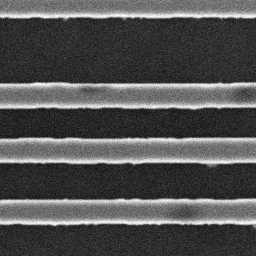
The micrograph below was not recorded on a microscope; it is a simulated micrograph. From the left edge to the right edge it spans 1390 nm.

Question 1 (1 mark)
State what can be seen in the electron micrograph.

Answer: lines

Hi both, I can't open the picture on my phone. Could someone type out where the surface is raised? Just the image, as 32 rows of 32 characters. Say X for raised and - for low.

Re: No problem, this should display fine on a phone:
XXXXXXXXXXXXXXXXXXXXXXXXXXXXXXXX
XXXXXXXXXXXXXXXXXXXXXXXXXXXXXXXX
--------------------------------
--------------------------------
--------------------------------
--------------------------------
--------------------------------
--------------------------------
--------------------------------
--------------------------------
----XXXXX------------------X-XXX
XXXXXXXXXXXXXXXXXXXXXXXXXXXXXXXX
XXXXXXXXXXXXXXXXXXXXXXXXXXXXXXXX
------------------------X-------
--------------------------------
--------------------------------
--------------------------------
XXXXXXXXXXXXXXXXXXXXXXXXXXXXXXXX
XXXXXXXXXXXXXXXXXXXXXXXXXXXXXXXX
XXXXXXXXXXXXXXXXXXXXXXXXXXXXXXXX
--------------------------------
--------------------------------
--------------------------------
--------------------------------
--------------------------------
XXXXXXXXXXXXXXXXXXXXXXXXXXXXXXXX
XXXXXXXXXXXXXXXXXXXXXXXXXXXXXXXX
XXXXXXXXXXXXXXXXXXXXXXXXXXXXXXXX
--------------------------------
--------------------------------
--------------------------------
--------------------------------